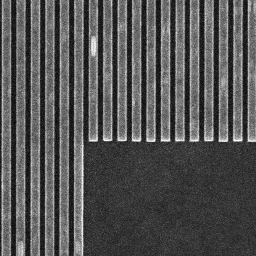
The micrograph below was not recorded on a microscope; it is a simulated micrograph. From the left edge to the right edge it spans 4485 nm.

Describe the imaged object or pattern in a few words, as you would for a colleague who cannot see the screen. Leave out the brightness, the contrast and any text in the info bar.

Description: parallel lines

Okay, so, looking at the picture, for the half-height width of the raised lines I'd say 147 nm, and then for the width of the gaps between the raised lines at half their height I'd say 0.103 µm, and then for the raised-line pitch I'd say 253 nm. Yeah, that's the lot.